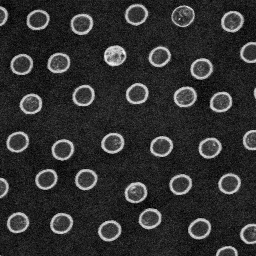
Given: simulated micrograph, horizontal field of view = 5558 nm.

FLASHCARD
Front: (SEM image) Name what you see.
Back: a regular array of raised bodies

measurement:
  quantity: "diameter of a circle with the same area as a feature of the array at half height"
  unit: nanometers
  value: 437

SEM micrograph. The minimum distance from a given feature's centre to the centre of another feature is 894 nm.